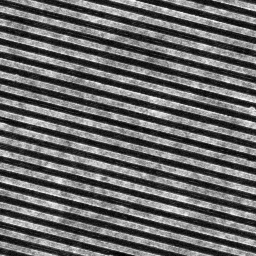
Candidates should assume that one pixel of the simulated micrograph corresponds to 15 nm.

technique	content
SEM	parallel lines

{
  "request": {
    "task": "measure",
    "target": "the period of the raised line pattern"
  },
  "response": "190 nanometres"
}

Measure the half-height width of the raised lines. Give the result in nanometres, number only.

99.9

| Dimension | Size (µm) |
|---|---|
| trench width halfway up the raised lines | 0.0873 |